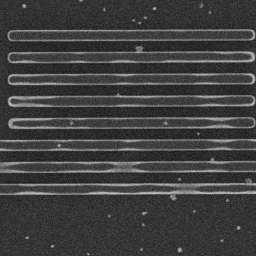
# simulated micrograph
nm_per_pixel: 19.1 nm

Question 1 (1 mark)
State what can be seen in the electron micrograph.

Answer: groups of lines, slits or small figures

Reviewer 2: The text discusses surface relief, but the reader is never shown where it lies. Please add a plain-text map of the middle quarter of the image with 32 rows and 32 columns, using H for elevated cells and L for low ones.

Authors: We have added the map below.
LLLLLLLLLLLLLLLLLLLLLLLLLLLLLLLL
LLLLLLLLLLLLLLLLLLLLLLLLLLLLLLLL
LLLLLLLLLLLLLLLLLLLLLLLLLLLLLLLL
HHHHHHHHHHHHHHHHHHHHHHHHHHHHHHHH
HHHHHHHHHHHHHHHHHHHHHHHHHHHHHHHH
LLLLLLLLLLLLLLLLLLLLLLLLLLLLLLLL
LLLLLLLLLLLLLLLLLLLLLLLLLLLLLLLL
LLLLLLLLLLLLLLLLLLLLLLLLLLLLLLLL
HHHHHHHHHHHHHHHHHHHHHHHHHHHHHHHH
HHHHHHHHHHHHHHHHHHHHHHHHHHHHHHHH
HHHHHHHHHHHHHHLLLLLLLLLLLLLLLLLL
LLLLLLLLLLLLLLLLLLLLLLLLLLLLLLLL
LLLLLLLLLLLLLLLLLLLLLLLLLLLLLLLL
LLLLLLLLLLLLLLLLLLLLLLLLLLLLLLLL
HHHHHHHHHHHHHHHHHHHHHHHHHHHHHHHH
HHHHHHHHHHHHHHHHHHHHHHHHHHHHHHHH
LLLLLLLLLLLLLLLLLLLLLLLLLLLLLLLL
LLLLLLLLLLLLLLLLLLLLLLLLLLLLLLLL
LLLLLLLLLLLLLLLLLLLLLLLLLLLLLLLL
HHHHHHHHHHHHHHHHHHHHHHHHHHHHHHHH
HHHHHHHHHHHHHHHHHHHHHHHHHHHHHHHH
HHHHHHHHHHHHHHHLLLHHHHHHHHHHHHHH
LLLLLLLLLLLLLLLLLLLLLLLLLLLLLLLL
LLLLLLLLLLLLLLLLLLLLLLLLLLLLLLLL
LLLLLLLLLLLLLLLLLLLLLHHHHHHHHHHH
HHHHHHHHHHHHHHHHHHHHHHHHHHHHHHHH
HHHHHHHHHHHHHHHHHHHHHHHHHHHHHHHH
LLLLLLLLLLLLLLLLLLLLLLLLLLLLLLLL
LLLLLLLLLLLLLLLLLLLLLLLLLLLLLLLL
LLLLLLLLLLLLLLLLLLLLLLLLLLLLLLLL
HHHHHHHHHHHHHHHHHHHHHHHHHHHHHHHH
HHHHHHHHHHHHHHHHHHHHHHHHHHHHHHHH